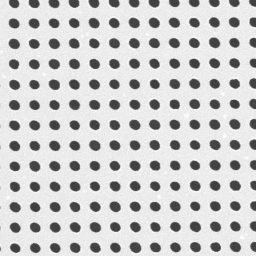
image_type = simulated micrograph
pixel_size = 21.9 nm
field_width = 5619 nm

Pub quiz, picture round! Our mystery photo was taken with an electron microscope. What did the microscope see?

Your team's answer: a regular array of holes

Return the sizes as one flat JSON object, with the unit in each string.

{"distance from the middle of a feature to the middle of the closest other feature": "0.437 um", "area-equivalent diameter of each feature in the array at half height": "231 nanometres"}